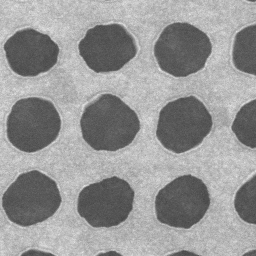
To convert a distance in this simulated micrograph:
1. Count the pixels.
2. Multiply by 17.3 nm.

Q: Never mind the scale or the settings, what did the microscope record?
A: a regular array of holes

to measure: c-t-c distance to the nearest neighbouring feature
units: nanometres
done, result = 1290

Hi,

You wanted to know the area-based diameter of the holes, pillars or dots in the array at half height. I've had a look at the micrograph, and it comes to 959 nanometres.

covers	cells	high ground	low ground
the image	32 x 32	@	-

@@@@@@@@@@@@@@@@@@@@@@@@@@@@@@@@
@@@@@@@@@@@@@@@@@@@@@@@@@@@@@@@@
@@@@@@@@@@@@@@@@@@@@@@@@@@@@@@@@
@@@@@@@@@@@-----@@@@@----@@@@@@-
@-----@@@@@-----@@@@------@@@---
@------@@@-------@@-------@@@---
@------@@@-------@@-------@@@---
@------@@@------@@@@------@@@---
@-----@@@@@----@@@@@-----@@@@@--
@@@-@@@@@@@@@@@@@@@@@@--@@@@@@@@
@@@@@@@@@@@@@@@@@@@@@@@@@@@@@@@@
@@@@@@@@@@@@@@@@@@@@@@@@@@@@@@@@
@@----@@@@@@---@@@@@@@---@@@@@@@
@------@@@@-----@@@@------@@@@--
@------@@@-------@@@------@@@---
@-------@@--------@@-------@@---
@------@@@-------@@@------@@@---
@------@@@@------@@@-----@@@@@--
@@----@@@@@@---@@@@@@---@@@@@@@-
@@@@@@@@@@@@@@@@@@@@@@@@@@@@@@@@
@@@@@@@@@@@@@@@@@@@@@@@@@@@@@@@@
@@@--@@@@@@@@@@@@@@@@@@@@@@@@@@@
@@-----@@@@@@---@@@@@@---@@@@@@-
@------@@@@------@@@------@@@@--
--------@@-------@@-------@@@---
--------@@-------@@-------@@@---
@------@@@------@@@-------@@@@--
@-----@@@@@-----@@@@-----@@@@@--
@@@@@@@@@@@@@@@@@@@@@@@-@@@@@@@@
@@@@@@@@@@@@@@@@@@@@@@@@@@@@@@@@
@@@@@@@@@@@@@@@@@@@@@@@@@@@@@@@@
@@@---@@@@@@@--@@@@@@@--@@@@@@@-